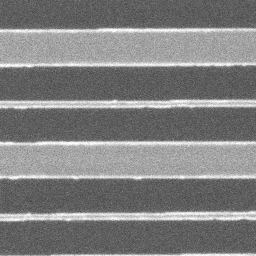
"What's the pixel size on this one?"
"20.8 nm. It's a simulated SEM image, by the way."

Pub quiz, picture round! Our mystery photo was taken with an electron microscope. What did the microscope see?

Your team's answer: lines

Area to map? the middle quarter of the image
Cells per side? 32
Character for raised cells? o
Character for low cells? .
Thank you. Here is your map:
................................
................................
................................
................................
................................
................................
................................
................................
................................
oooooooooooooooooooooooooooooooo
oooooooooooooooooooo.oooooo.....
................................
................................
................................
................................
................................
................................
................................
................................
................................
oooooooooooooooooooooooooooooooo
oooooooooooooooooooooooooooooooo
oooooooooooooooooooooooooooooooo
oooooooooooooooooooooooooooooooo
oooooooooooooooooooooooooooooooo
oooooooooooooooooooooooooooooooo
oooooooooooooooooooooooooooooooo
oooooooooooooooooooooooooooooooo
................................
................................
................................
................................